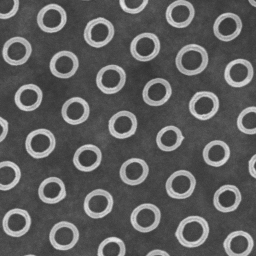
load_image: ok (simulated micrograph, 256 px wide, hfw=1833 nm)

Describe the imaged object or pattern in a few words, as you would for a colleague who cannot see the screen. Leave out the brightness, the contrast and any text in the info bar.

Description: a regular array of ring-shaped raised bodies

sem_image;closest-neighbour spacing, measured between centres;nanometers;337